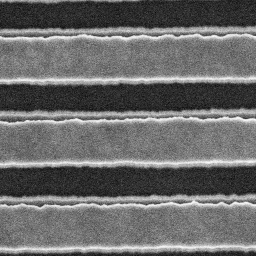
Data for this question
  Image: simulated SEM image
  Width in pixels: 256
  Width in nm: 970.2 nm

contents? lines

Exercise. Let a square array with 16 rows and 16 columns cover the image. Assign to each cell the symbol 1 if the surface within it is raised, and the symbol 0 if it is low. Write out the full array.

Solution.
0000000000000000
0000000000000000
1111111111111111
1111111111111111
1111111111111111
0000000000000000
0000000000000000
1111111111111111
1111111111111111
1111111111111111
0000000000000000
0000000000000000
1111111111111111
1111111111111111
1111111111111111
1111111111111101